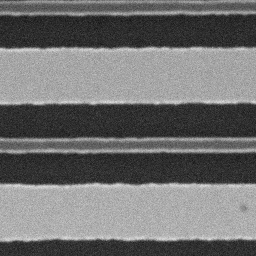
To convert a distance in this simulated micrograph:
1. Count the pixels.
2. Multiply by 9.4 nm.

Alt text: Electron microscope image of lines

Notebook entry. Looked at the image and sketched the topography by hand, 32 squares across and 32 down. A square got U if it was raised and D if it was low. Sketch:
UUUUUUUUUUUUUUUUUUUUUUUUUUUUUUUU
UUUUUUUUUUUUUUUUUUUUUUUUUUUUUUUU
DDDDDDDDDDDDDDDDDDDDDDDDDDDDDDDD
DDDDDDDDDDDDDDDDDDDDDDDDDDDDDDDD
DDDDDDDDDDDDDDDDDDDDDDDDDDDDDDDD
DDDDDDDDDDDDDDDDDDDDDDDDDDDDDDDD
UUUUUUUUUUUUUUUUUUUUUUUUUUUUUUUU
UUUUUUUUUUUUUUUUUUUUUUUUUUUUUUUU
UUUUUUUUUUUUUUUUUUUUUUUUUUUUUUUU
UUUUUUUUUUUUUUUUUUUUUUUUUUUUUUUU
UUUUUUUUUUUUUUUUUUUUUUUUUUUUUUUU
UUUUUUUUUUUUUUUUUUUUUUUUUUUUUUUU
UUUUUUUUUUUUUUUUUUUUUUUUUUUUUUUU
DDDDDDDDDDDDDDDDDDDDDDDDDDDDDDDD
DDDDDDDDDDDDDDDDDDDDDDDDDDDDDDDD
DDDDDDDDDDDDDDDDDDDDDDDDDDDDDDDD
DDDDDDDDDDDDDDDDDDDDDDDDDDDDDDDD
UUUUUUUUUUUUUUUUUUUUUUUUUUUUUUUU
UUUUUUUUUUUUUUUUUUUUUUUUUUUUUUUU
DDDDDDDDDDDDDDDDDDDDDDDDDDDDDDDD
DDDDDDDDDDDDDDDDDDDDDDDDDDDDDDDD
DDDDDDDDDDDDDDDDDDDDDDDDDDDDDDDD
DDDDDDDDDDDDDDDDDDDDDDDDDDDDDDDD
UUUUUUUUUUUUUUUUUUUUUUUUUUUUUUUU
UUUUUUUUUUUUUUUUUUUUUUUUUUUUUUUU
UUUUUUUUUUUUUUUUUUUUUUUUUUUUUUUU
UUUUUUUUUUUUUUUUUUUUUUUUUUUUUUUU
UUUUUUUUUUUUUUUUUUUUUUUUUUUUUUUU
UUUUUUUUUUUUUUUUUUUUUUUUUUUUUUUU
UUUUUUUUUUUUUUUUUUUUUUUUUUUUUUUU
DDDDDDDDDDDDDDDDDDDDDDDDDDDDDDDD
DDDDDDDDDDDDDDDDDDDDDDDDDDDDDDDD